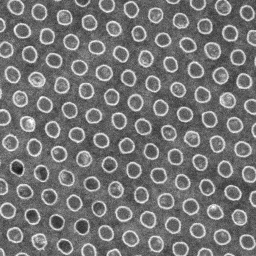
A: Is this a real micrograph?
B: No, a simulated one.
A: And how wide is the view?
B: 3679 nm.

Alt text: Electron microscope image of a regular array of raised bodies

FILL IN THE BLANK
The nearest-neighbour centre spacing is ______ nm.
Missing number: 358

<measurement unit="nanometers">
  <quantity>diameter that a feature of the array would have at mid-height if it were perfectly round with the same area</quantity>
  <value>218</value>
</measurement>